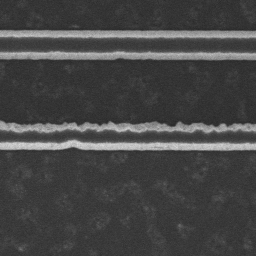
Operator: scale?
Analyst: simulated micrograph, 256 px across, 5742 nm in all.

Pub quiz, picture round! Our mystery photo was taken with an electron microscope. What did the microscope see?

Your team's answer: one or a few lines or trenches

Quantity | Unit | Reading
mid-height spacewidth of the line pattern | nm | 1590